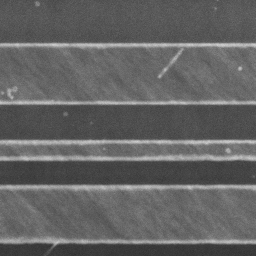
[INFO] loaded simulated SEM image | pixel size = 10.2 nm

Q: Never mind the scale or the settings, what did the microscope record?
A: lines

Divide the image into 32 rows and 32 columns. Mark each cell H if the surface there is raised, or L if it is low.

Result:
LLLLLLLLLLLLLLLLLLLLLLLLLLLLLLLL
LLLLLLLLLLLLLLLLLLLLLLLLLLLLLLLL
LLLLLLLLLLLLLLLLLLLLLLLLLLLLLLLL
LLLLLLLLLLLLLLLLLLLLLLLLLLLLLLLL
LLLLLLLLLLLLLLLLLLLLLLLLLLLLLLLL
LLLLLLLLLLLLLLLLLLLLLLLLLLLLLLLL
HHHHHHHHHHHHHHHHHHHHHHHHHHHHHHHH
HHHHHHHHHHHHHHHHHHHHHHHHHHHHHHHH
HHHHHHHHHHHHHHHHHHHHHHHHHHHHHHHH
HHHHHHHHHHHHHHHHHHHHHHHHHHHHHHHH
HHHHHHHHHHHHHHHHHHHHHHHHHHHHHHHH
HHHHHHHHHHHHHHHHHHHHHHHHHHHHHHHH
HHHHHHHHHHHHHHHHHHHHHHHHHHHHHHHH
LLLLLLLLLLLLLLLLLLLLLLLLLLLLLLLL
LLLLLLLLLLLLLLLLLLLLLLLLLLLLLLLL
LLLLLLLLLLLLLLLLLLLLLLLLLLLLLLLL
LLLLLLLLLLLLLLLLLLLLLLLLLLLLLLLL
LLLLLLLLLLLLLLLLLLLLLLLLLLLLLLLL
HHHHHHHHHHHHHHHHHHHHHHHHHHHHHHHH
HHHHHHHHHHHHHHHHHHHHHHHHHHHHHHHH
LLLLLLLLLLLLLLLLLLLLLLLLLLLLLLLL
LLLLLLLLLLLLLLLLLLLLLLLLLLLLLLLL
LLLLLLLLLLLLLLLLLLLLLLLLLLLLLLLL
HHHHHHHHHHHHHHHHHHHHHHHHHHHHHHHH
HHHHHHHHHHHHHHHHHHHHHHHHHHHHHHHH
HHHHHHHHHHHHHHHHHHHHHHHHHHHHHHHH
HHHHHHHHHHHHHHHHHHHHHHHHHHHHHHHH
HHHHHHHHHHHHHHHHHHHHHHHHHHHHHHHH
HHHHHHHHHHHHHHHHHHHHHHHHHHHHHHHH
HHHHHHHHHHHHHHHHHHHHHHHHHHHHHHHH
LLLLLLLLLLLLLLLLLLLLLLLLLLLLLLLL
LLLLLLLLLLLLLLLLLLLLLLLLLLLLLLLL